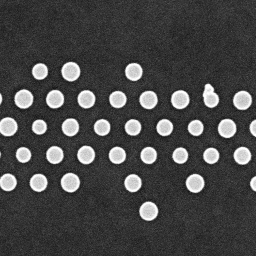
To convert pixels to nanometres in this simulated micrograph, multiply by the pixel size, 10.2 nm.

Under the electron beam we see a regular array of raised bodies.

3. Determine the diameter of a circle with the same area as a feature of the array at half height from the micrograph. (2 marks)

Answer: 166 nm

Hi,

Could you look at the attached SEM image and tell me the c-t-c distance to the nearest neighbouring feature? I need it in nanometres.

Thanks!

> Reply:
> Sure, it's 318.